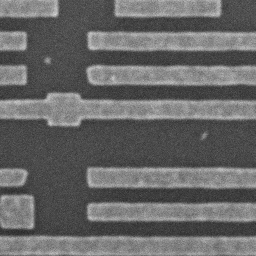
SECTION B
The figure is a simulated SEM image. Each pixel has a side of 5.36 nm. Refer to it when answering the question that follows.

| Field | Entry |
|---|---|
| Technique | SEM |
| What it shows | wiring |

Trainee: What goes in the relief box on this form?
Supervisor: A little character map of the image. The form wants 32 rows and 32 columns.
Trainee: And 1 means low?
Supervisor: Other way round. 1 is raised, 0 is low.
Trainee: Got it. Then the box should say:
11111110000000011111111111110000
11111110000000011111111111110000
00000000000000000000000000000000
00000000000000000000000000000000
11100000000111111111111111111111
11100000000111111111111111111111
00000000000000000000000000000000
00000000000000000000000000000000
11100000000111111111111111111111
11100000000111111111111111111111
00000000000000000000001111110001
00000000000000000000000000000000
00000111111000000000000000000000
11111111111111111111111111111111
11111111111111111111111111111111
00000011110000000000000000000000
00000000000000000000000000000000
00000000000000000000000000000000
00000000000000000000000000000000
00000000000000000000000000000000
00000000000000000000000000000000
11100000000111111111111111111111
11100000000111111111111111111111
00000000000000000000000000000000
01110000000000000000000000000000
11110000000111111111111000111111
11110000000111111111111111111111
11110000000011111011101100111111
01110000000000000000000000000000
00000000000000000000000000000000
11111111111111111111111111111111
11111111111111111111111111111111